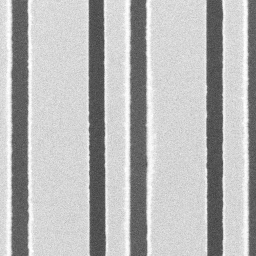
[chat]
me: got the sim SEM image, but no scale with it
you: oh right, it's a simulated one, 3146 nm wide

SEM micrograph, lines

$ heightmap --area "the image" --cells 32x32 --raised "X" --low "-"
X---XXXXXXX--XXX--XXXXXXXX--XXX-
X---XXXXXXX--XXX--XXXXXXXX--XXX-
X---XXXXXXX--XXX--XXXXXXXX--XXX-
X---XXXXXXX--XXX--XXXXXXXX--XXX-
X---XXXXXXX--XXX--XXXXXXXX--XXX-
X---XXXXXXX--XXX--XXXXXXXX--XXX-
X---XXXXXXX--XXX--XXXXXXXX--XXX-
X---XXXXXXX--XXX--XXXXXXXX--XXX-
X---XXXXXXX--XXX--XXXXXXXX--XXX-
X---XXXXXXX--XXX--XXXXXXXX--XXX-
X---XXXXXXX--XXX--XXXXXXXX--XXX-
X---XXXXXXX--XXX--XXXXXXXX--XXX-
X---XXXXXXX--XXX--XXXXXXXX--XXX-
X---XXXXXXX--XXX--XXXXXXXX--XXX-
X---XXXXXXX--XXX--XXXXXXXX--XXX-
X---XXXXXXX--XXX--XXXXXXXX--XXX-
X---XXXXXXX--XXX--XXXXXXXX--XXX-
X---XXXXXXX--XXX--XXXXXXXX--XXX-
X---XXXXXXX--XXX--XXXXXXXX--XXX-
X---XXXXXXX--XXX--XXXXXXXX--XXX-
X---XXXXXXX--XXX--XXXXXXXX--XXX-
X---XXXXXXX--XXX--XXXXXXXX--XXX-
X---XXXXXXX--XXX--XXXXXXXX--XXX-
X---XXXXXXX--XXX--XXXXXXXX--XXX-
X---XXXXXXX--XXX--XXXXXXXX--XXX-
X---XXXXXXX--XXX--XXXXXXXX--XXX-
X---XXXXXXX--XXX--XXXXXXXX--XXX-
X---XXXXXXX--XXX--XXXXXXXX--XXX-
X---XXXXXXX--XXX--XXXXXXXX--XXX-
X---XXXXXXX--XXX--XXXXXXXX--XXX-
X---XXXXXXX--XXX--XXXXXXXX--XXX-
X---XXXXXXX--XXX--XXXXXXXX--XXX-